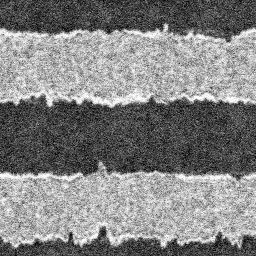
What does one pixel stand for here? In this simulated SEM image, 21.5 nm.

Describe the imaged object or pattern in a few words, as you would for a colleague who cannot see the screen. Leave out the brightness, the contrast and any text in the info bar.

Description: one or a few lines or trenches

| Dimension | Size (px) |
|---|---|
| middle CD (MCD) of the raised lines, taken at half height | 62.5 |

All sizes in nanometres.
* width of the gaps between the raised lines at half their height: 1690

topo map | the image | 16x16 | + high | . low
................
................
++++++++++++++++
++++++++++++++++
++++++++++++++++
++++++++++++++++
................
................
................
................
................
++++++++++++++++
++++++++++++++++
++++++++++++++++
++++++.+++++++++
................